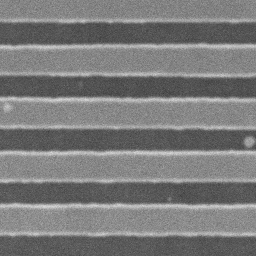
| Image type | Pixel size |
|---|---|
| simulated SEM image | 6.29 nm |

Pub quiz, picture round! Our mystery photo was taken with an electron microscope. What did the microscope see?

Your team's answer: lines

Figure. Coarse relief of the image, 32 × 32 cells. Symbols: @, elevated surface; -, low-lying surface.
@@@@@@@@@@@@@@@@@@@@@@@@@@@@@@@@
@@@@@@@@@@@@@@@@@@@@@@@@@@@@@@@@
@@@@@@@@@@@@@@@@@@@@@@@@@@@@@@@@
--------------------------------
--------------------------------
--------------------------------
@@@@@@@@@@@@@@@@@@@@@@@@@@@@@@@@
@@@@@@@@@@@@@@@@@@@@@@@@@@@@@@@@
@@@@@@@@@@@@@@@@@@@@@@@@@@@@@@@@
-----------------------@@@@@@@@@
--------------------------------
--------------------------------
@@@@@@@@@@@@@@@@@@@@@@@@@@@@@@@@
@@@@@@@@@@@@@@@@@@@@@@@@@@@@@@@@
@@@@@@@@@@@@@@@@@@@@@@@@@@@@@@@@
@@@@@@@@@@@@@@@@@@@@@@@@@@@@@@@@
--------------------------------
--------------------------------
--------------------------------
@@@@@@@@@@@@@@@@@@@@@@@@@@@@@@@@
@@@@@@@@@@@@@@@@@@@@@@@@@@@@@@@@
@@@@@@@@@@@@@@@@@@@@@@@@@@@@@@@@
@@@@@@@@@@@@@@@@@@@@@@@@@@@@@@@@
--------------------------------
--------------------------------
-@@-----------------------------
@@@@@@@@@@@@@@@@@@@@@@@@@@@@@@@@
@@@@@@@@@@@@@@@@@@@@@@@@@@@@@@@@
@@@@@@@@@@@@@@@@@@@@@@@@@@@@@@@@
--------------------------------
--------------------------------
--------------------------------